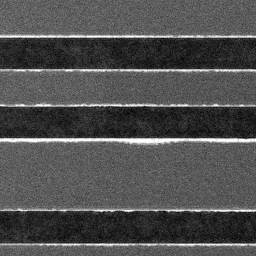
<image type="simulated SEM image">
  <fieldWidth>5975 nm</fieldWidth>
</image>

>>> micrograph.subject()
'lines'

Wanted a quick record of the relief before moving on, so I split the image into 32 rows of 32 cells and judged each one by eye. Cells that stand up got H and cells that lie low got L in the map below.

HHHHHHHHHHHHHHHHHHHHHHHHHHHHHHHH
HHHHHHHHHHHHHHHHHHHHHHHHHHHHHHHH
HHHHHHHHHHHHHHHHHHHHHHHHHHHHHHHH
HHHHHHHHHHHHHHHHHHHHHHHHHHHHHHHH
HHHHHHHHHHHHHHHHHHHHHHHHHHHHHHHH
LLLLLLLLLLLLLLLLLLLLLLLLLLLLLLLL
LLLLLLLLLLLLLLLLLLLLLLLLLLLLLLLL
LLLLLLLLLLLLLLLLLLLLLLLLLLLLLLLL
LLLLLLLLLLLLLLLLLLLLLLLLLLLLLLLL
HHHHHHHHHHHHHHHHHHHHHHHHHHHHHHHH
HHHHHHHHHHHHHHHHHHHHHHHHHHHHHHHH
HHHHHHHHHHHHHHHHHHHHHHHHHHHHHHHH
HHHHHHHHHHHHHHHHHHHHHHHHHHHHHHHH
LLLLLLLLLLLLLLLLLLLLLLLLLLLLLLLL
LLLLLLLLLLLLLLLLLLLLLLLLLLLLLLLL
LLLLLLLLLLLLLLLLLLLLLLLLLLLLLLLL
LLLLLLLLLLLLLLLLLLLLLLLLLLLLLLLL
HHHHHHHHHHHHHHHHLLLLLHHHHHHLLLLL
HHHHHHHHHHHHHHHHHHHHHHHHHHHHHHHH
HHHHHHHHHHHHHHHHHHHHHHHHHHHHHHHH
HHHHHHHHHHHHHHHHHHHHHHHHHHHHHHHH
HHHHHHHHHHHHHHHHHHHHHHHHHHHHHHHH
HHHHHHHHHHHHHHHHHHHHHHHHHHHHHHHH
HHHHHHHHHHHHHHHHHHHHHHHHHHHHHHHH
HHHHHHHHHHHHHHHHHHHHHHHHHHHHHHHH
HHHHHHHHHHHHHHHHHHHHHHHHHHHHHHHH
LLLLLLLLLLLLLLLLLLLLLLLLLLLLLLLL
LLLLLLLLLLLLLLLLLLLLLLLLLLLLLLLL
LLLLLLLLLLLLLLLLLLLLLLLLLLLLLLLL
LLLLLLLLLLLLLLLLLLLLLLLLLLLLLLLL
LLLLLLLLLLLLLLLLLLLLLLLLLLLLLLLL
HHHHHHHHHHHHHHHHHHHHHHHHHHHHHHHH